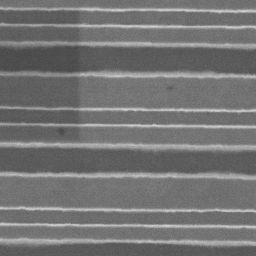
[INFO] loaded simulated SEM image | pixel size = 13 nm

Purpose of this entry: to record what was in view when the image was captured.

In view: lines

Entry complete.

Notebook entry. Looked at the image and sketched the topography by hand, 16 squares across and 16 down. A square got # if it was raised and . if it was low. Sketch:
################
################
################
................
................
################
################
################
################
................
................
################
################
################
################
................